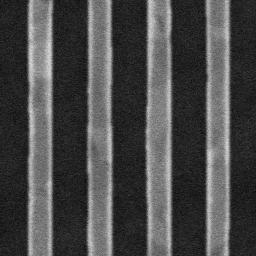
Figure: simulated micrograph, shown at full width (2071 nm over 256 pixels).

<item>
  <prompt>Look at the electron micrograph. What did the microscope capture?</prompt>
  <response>lines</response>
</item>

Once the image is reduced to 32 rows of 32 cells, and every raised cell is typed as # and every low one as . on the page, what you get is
....##.....###.....##.....##....
....##.....###.....##.....##....
....##.....###.....##.....##....
....##.....###.....##.....##....
....##.....###.....##.....##....
....##.....###.....##.....###...
....##.....###.....##.....##....
....##.....###.....##.....##....
....##.....###.....##.....##....
....##.....###.....##.....##....
....##.....###.....##.....##....
....##.....###.....##.....##....
....##.....###.....##.....##....
....##.....###.....##.....##....
....##.....###....###.....##....
....##.....###....###.....##....
....##.....###....###.....##....
....##.....###....###.....##....
....##.....###....###.....##....
....##.....###....###.....##....
....##.....###....###.....###...
....##.....###.....##.....###...
....##.....###.....##.....##....
....##.....###.....##.....###...
....##.....###.....##.....##....
....##.....###.....##.....##....
....##.....###.....##.....##....
....##.....###.....##.....##....
....##.....###.....##.....##....
....##.....###.....##.....##....
....##.....###.....##.....##....
....##.....###.....##.....##....